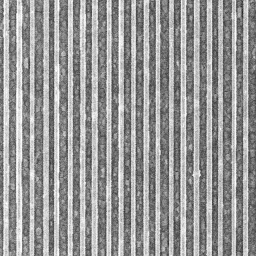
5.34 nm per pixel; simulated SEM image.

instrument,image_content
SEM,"parallel lines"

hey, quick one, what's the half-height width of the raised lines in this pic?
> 21.4 nanometers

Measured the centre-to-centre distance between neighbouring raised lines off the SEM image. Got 67.4 nm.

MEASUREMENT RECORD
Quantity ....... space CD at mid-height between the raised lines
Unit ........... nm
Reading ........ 43.4